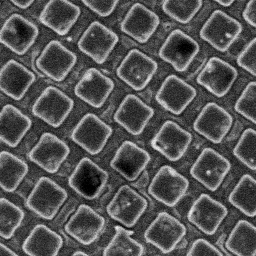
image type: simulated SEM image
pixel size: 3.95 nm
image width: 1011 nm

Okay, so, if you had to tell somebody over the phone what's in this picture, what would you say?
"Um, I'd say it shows a regular array of raised bodies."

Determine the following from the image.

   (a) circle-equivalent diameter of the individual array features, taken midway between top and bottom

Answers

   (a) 143 nanometres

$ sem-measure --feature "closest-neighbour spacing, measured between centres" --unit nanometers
180